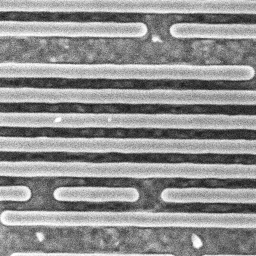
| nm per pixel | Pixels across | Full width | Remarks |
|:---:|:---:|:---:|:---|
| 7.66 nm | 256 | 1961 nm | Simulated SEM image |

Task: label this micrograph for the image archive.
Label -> groups of lines, slits or small figures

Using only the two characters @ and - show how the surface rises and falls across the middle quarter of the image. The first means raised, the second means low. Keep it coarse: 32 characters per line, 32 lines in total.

@@@@@@@@@@@@@@@@@@@@@@@@@@@@@@--
@@@@@@@@@@@@@@@@@@@@@@@@@@@@@@@@
@@@@@@@@@@@@@@@@@@@@@@@@@@@@@@@@
-@@--@@@@@@@@@@@@@@@@@@@@@@@@@@@
--------------------------------
--------------------------------
@@@-----------------------------
@@@@@@@@@@@@@@@@@@@@@@@@@@@@@@@@
@@@@@@@@@@@@@@@@@@@@@@@@@@@@@@@@
-----@@@@@@@@@@@@@@@@@@@@@@@@@@@
--------------------------------
--------------------------------
-@@@-@@-------------------------
@@@@@@@@@@@@@@@@@@@@@@@@@@@@@@@@
@@@@@@@@@@@@@@@@@@@@@@@@@@@@@@@@
@@@@@@@@@@@@@@@@@@@@@@@@@@@@@@@@
--------------------------------
--------------------------------
--------------------------------
@@@@@@@@@@@@@@@@@@@@@@@@@@@@@@@@
@@@@@@@@@@@@@@@@@@@@@@@@@@@@@@@@
@@@@@@@@@@@@@@@@@@@@@@@@@@@@@@@@
--------------------------------
--------------------------------
--------------------------------
@@@@@@@@@@@@@@@@@@@@@@@@@@@@@@@@
@@@@@@@@@@@@@@@@@@@@@@@@@@@@@@@@
@@@@@@@@@@@@@@@@@@@@@@@@@@@@@@@@
--------------------------------
--------------------------------
--------------------------------
@@@@@@@@@@@@@@@@@@-------@@@@@@@